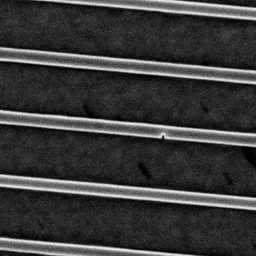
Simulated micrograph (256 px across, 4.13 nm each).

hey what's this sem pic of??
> one or a few lines or trenches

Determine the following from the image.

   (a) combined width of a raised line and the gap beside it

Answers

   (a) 260 nm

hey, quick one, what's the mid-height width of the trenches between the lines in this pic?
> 212 nanometres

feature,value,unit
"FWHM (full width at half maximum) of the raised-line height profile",46.3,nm